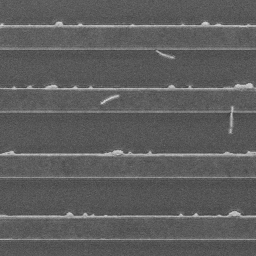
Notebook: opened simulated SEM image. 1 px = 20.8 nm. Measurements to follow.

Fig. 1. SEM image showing lines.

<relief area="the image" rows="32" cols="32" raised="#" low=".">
................................
................................
................................
################################
################################
################################
................................
................................
................................
................................
................................
################################
################################
################################
................................
................................
................................
................................
................................
################################
################################
################################
................................
................................
................................
................................
................................
################################
################################
################################
................................
................................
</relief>